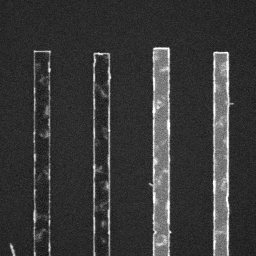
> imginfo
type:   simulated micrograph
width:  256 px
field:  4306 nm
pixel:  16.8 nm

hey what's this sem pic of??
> parallel lines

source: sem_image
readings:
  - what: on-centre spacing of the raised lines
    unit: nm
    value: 1000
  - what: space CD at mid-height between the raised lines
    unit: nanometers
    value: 746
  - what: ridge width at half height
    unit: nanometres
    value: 256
